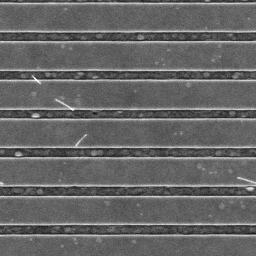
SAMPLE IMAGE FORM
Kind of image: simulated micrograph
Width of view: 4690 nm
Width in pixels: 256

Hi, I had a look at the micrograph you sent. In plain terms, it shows parallel lines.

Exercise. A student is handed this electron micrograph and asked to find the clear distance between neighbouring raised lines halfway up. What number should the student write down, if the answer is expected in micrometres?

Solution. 0.174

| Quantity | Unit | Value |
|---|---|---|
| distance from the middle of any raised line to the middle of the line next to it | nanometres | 707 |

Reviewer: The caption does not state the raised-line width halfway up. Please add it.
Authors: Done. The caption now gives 28.9 px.